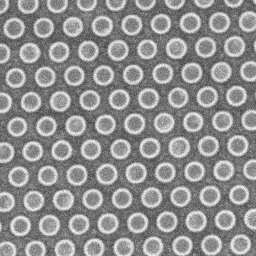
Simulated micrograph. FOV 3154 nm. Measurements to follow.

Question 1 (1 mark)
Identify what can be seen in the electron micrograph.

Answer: a regular array of raised bodies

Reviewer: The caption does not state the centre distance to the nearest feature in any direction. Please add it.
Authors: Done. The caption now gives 351 nm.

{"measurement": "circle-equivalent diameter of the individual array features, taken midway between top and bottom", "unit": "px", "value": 18.4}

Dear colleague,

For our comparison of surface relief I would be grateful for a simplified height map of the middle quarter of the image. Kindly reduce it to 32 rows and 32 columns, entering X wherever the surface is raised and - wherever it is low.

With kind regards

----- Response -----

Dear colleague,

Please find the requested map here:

------------------------XX-----X
-XXX----XXXX----XXX----XXXX---XX
-XXXX---XXXX---XXXX----XXXX---XX
XXXXX---XXXX---XXXX----XXXX---XX
-XXX----XXX-----XX------X------X
--------------------------------
----------------------------XX--
-----XXX----XXXX---XXXX----XXXX-
X---XXXXX---XXXX---XXXX---XXXXX-
X---XXXXX---XXXX---XXXX----XXX--
X----XXX----XXX-----XXX----XXX--
--------------------------------
--------------------------------
--XX-----XXX----XXXX---XXXX---XX
-XXXX---XXXXX---XXXX---XXXX---XX
-XXXX---XXXXX---XXXX---XXXX---XX
-XXXX----XXX----XXX-----XX-----X
--X-----------------------------
--------------------------------
------XX-----XX-----XXX----XXXX-
X----XXXX---XXXX---XXXXX---XXXX-
XX---XXXX---XXXX---XXXXX---XXXX-
XX---XXXX---XXXX----XXX----XXX--
X-------------------------------
--------------------------------
----------XX-----XXX----XXX----X
-XXXX----XXXX---XXXX---XXXXX---X
-XXXXX--XXXXX---XXXX---XXXXX---X
-XXXX----XXXX---XXXX----XXX----X
--XXX----XXX-----X--------------
--------------------------------
---------------------XX-----XXX-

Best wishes